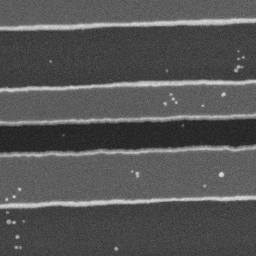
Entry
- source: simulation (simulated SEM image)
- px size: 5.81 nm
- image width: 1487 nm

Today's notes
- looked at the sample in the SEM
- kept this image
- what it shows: lines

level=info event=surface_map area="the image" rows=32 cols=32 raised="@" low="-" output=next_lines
@@@@@@@@@@@@@@@@@@@@@@@@@@@@@@@@
@@@@@@@@@@@@@@@@@@@@@@@@@@@@@@@@
@@@@@@@@@@@@@@@@@@@@@@@@@@@@@@@@
@-------------------------------
--------------------------------
--------------------------------
--------------------------------
--------------------------------
--------------------------------
--------------------------------
--------------------@@@@@@@@@@@@
@@@@@@@@@@@@@@@@@@@@@@@@@@@@@@@@
@@@@@@@@@@@@@@@@@@@@@@@@@@@@@@@@
@@@@@@@@@@@@@@@@@@@@@@@@@@@@@@@@
@@@@@@@@@@@@@@@@@@@@@@@@@@@@@@@@
--------------------------------
--------------------------------
--------------------------------
-------------------------@--@--@
@@@@@@@@@@@@@@@@@@@@@@@@@@@@@@@@
@@@@@@@@@@@@@@@@@@@@@@@@@@@@@@@@
@@@@@@@@@@@@@@@@@@@@@@@@@@@@@@@@
@@@@@@@@@@@@@@@@@@@@@@@@@@@@@@@@
@@@@@@@@@@@@@@@@@@@@@@@@@@@@@@@@
@@@@@@@@@@@@@@@@@@@@@@@@@@@@@@@@
@@@@@@--------------------------
--------------------------------
--------------------------------
--------------------------------
--------------------------------
--------------------------------
--------------------------------